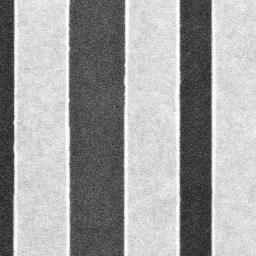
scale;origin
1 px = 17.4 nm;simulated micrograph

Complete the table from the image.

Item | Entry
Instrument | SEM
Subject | lines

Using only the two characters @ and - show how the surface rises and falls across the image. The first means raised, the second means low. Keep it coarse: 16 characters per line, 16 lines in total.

-@@@----@@@--@@@
-@@@----@@@--@@@
-@@@----@@@--@@@
-@@@----@@@--@@@
-@@@----@@@--@@@
-@@@----@@@--@@@
-@@@----@@@--@@@
-@@@----@@@--@@@
-@@@----@@@--@@@
-@@@----@@@--@@@
-@@@----@@@--@@@
-@@@----@@@--@@@
-@@@----@@@--@@@
-@@@----@@@--@@@
-@@@----@@@--@@@
-@@@----@@@--@@@